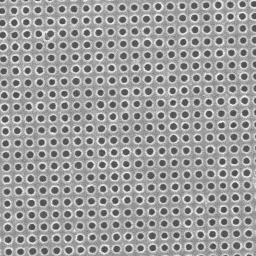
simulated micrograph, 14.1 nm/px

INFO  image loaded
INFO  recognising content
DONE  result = a regular array of holes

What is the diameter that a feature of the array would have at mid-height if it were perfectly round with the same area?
98.1 nm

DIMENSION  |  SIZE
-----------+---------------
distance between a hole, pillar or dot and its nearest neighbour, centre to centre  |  167 nm